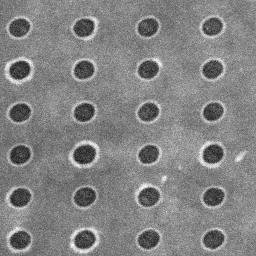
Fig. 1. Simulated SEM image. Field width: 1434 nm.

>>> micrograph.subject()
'a regular array of holes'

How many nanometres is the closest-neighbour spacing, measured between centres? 237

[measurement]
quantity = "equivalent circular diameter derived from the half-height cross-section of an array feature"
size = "121 nanometers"